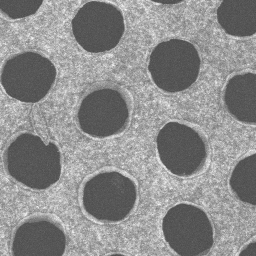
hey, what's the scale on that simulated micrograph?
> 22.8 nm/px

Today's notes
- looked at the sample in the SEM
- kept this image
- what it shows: holes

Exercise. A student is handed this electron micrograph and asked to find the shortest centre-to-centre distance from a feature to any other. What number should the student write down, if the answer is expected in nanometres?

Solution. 1920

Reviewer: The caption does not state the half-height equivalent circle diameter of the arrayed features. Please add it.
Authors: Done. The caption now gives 1200 nm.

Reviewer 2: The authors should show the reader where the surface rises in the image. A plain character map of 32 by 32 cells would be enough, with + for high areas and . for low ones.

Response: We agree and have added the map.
.....++++++...++++++..++++++....
....++++++.....++++++++++++.....
+++++++++......++++++++++++.....
+++++++++.......++++++++++++....
+++++++++......++++++++++++++..+
++++++++++.....+++++....++++++++
+++..++++++..++++++......+++++++
+.....+++++++++++++......+++++++
.......++++++++++++......+++++++
.......++++++++++++......++++...
.......++++++++++++.....++++....
+.....+++++....++++++.++++++....
++...+++++......++++++++++++....
++++++++++......++++++++++++....
++++++++++......+++++++++++++...
++++++++++......+++++..++++++++.
+++++++++++....+++++.....+++++++
++...+++++++++++++++.....+++++++
+......+++++++++++++......++++++
.......+++++++++++++......+++++.
........++++++++++++.....+++++..
+.......++++++.++++++....++++...
++.....++++.....+++++++++++++...
++++..++++.......++++++++++++...
++++++++++.......++++++++++++...
++++++++++.......+++++.++++++++.
+++++++++++.....+++++....+++++++
+++...++++++...+++++......++++++
++......++++++++++++.......+++++
++......+++++++++++++......+++++
++......+++++++++++++......++++.
+.......++++++++++++++....++++..